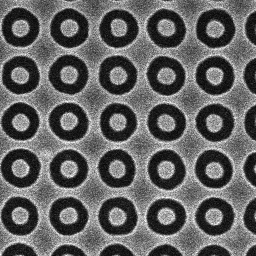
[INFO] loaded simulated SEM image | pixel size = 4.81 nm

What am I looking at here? a regular array of ring-shaped grooves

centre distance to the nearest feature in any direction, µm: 0.224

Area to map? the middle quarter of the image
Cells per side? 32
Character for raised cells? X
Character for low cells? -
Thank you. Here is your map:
------XXX---------XXX---------XX
XXX---XXX---XXX---XXX---XXX---XX
XXX---XXX---XXXX--XX---XXXXX--XX
XXX---XXX---XXXX--XXX--XXXXX--XX
XXX---XXX---XXX---XXX---XXX---XX
-----XXXX---------XXXX--------XX
-----XXXXX-------XXXXX-------XXX
X--XXXXXXXXX---XXXXXXXXX----XXXX
XXXXXXXXXXXXXXXXXXXXXXXXXXXXXXXX
XXXXXXXXXXXXXXXXXXXXXXXXXXXXXXXX
----XXXXXXX-----XXXXXXX-----XXXX
-----XXXXX-------XXXXX-------XXX
XX----XXX---------XXX---------XX
XXX---XXX---XXX---XXX---XXX---XX
XXX---XXX---XXX----XX---XXXX---X
XXX---XXX---XXX---XXX---XXXX---X
------XXX----X----XXX----XX---XX
-----XXXXX-------XXXXX--------XX
-----XXXXX------XXXXXXX------XXX
XXXXXXXXXXXX--XXXXXXXXXXXXXXXXXX
XXXXXXXXXXXXXXXXXXXXXXXXXXXXXXXX
---XXXXXXXX----XXXXXXXXX---XXXXX
----XXXXXX------XXXXXXX-----XXXX
-----XXXX--------XXXXX-------XXX
XX----XXX---XX----XXX----X----XX
XXX---XX---XXXX---XXX---XXXX--XX
XXX---XX---XXXX---XXX---XXXX---X
XXX---XXX---XXX---XXX---XXX----X
------XXX---------XXX---XX----XX
-----XXXXX-------XXXXX--------XX
----XXXXXXX-----XXXXXXX------XXX
XXXXXXXXXXXXXXXXXXXXXXXXX--XXXXX